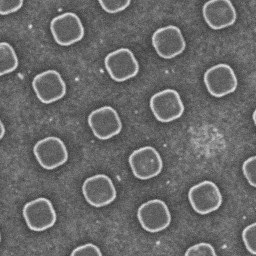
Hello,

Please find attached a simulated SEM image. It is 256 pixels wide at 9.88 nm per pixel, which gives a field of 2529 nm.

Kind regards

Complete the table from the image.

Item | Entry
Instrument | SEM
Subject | a regular array of raised bodies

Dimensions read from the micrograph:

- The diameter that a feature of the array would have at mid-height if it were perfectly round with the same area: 305 nm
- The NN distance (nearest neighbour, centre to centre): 562 nm